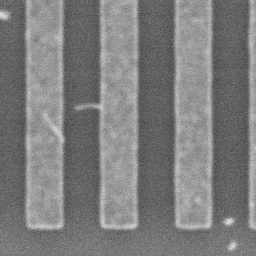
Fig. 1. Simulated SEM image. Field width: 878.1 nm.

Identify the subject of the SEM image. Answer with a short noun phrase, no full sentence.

groups of lines, slits or small figures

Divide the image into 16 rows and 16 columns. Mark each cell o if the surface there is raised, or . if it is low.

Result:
..oo..ooo..oo...
..oo..ooo..oo...
..oo..ooo..oo...
..oo..ooo..oo...
..oo..ooo..oo...
..oo..ooo..oo...
..oo..ooo..oo...
..oo..ooo..oo...
..oo..ooo..oo...
..oo..ooo..oo...
..oo..ooo..oo...
..oo..oo...oo...
..oo..oo...oo...
..oo..ooo..oo...
................
................